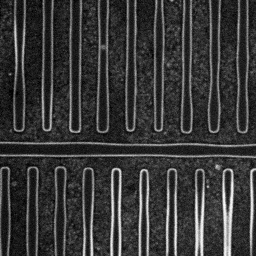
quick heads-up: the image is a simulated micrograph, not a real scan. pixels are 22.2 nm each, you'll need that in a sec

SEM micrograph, groups of lines, slits or small figures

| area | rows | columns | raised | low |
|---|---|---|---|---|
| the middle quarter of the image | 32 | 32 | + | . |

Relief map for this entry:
..++.....++.....++.....++.....++
..++.....++.....++.....++.....+.
..++.....++.....++.....++.....+.
..++.....++.....++.....++.....+.
..++.....++.....++.....++.....+.
..++.....++.....++.....++.....+.
..++.....++.....++.....++.....+.
..++.....++.....++.....++.....++
..++.....++.....++.....++.....++
..++....+++.....++.....++.....++
..++....+++.....++.....++.....++
..++....+++.....++.....++.....++
..++....+++.....++.....++.....++
..++....+++.....++.....++.....++
..++....+++.....++.....++....+++
.+++....+++.....++.....++....+++
..++....+++.....+......+.....+++
................................
................................
................................
++++++++++++++++++++++++++++++++
++++++++++++++++++++++++++++++++
++++++++++++++++++++++++++++++++
................................
................................
................................
.....++.....++............++....
.....++.....++.....++.....++....
.....++.....++.....++.....++....
.....++.....++.....++.....++....
.....++.....++.....++.....++....
.....++.....++.....++.....++....